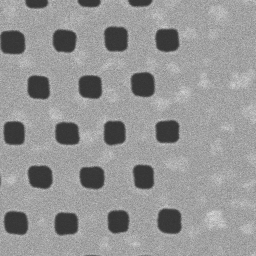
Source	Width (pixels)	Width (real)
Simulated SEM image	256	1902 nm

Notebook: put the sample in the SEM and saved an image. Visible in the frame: a regular array of holes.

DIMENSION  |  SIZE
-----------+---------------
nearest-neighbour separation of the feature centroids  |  51 pixels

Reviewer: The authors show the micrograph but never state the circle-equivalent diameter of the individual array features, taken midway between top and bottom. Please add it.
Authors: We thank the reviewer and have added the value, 184 nm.